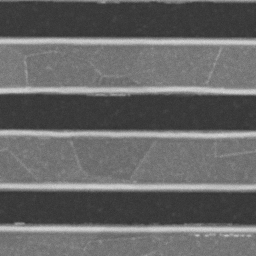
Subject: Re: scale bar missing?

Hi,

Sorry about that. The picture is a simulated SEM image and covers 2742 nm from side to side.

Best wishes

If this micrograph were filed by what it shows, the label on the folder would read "one or a few lines or trenches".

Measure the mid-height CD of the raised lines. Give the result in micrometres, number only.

0.543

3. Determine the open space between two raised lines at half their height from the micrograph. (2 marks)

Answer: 459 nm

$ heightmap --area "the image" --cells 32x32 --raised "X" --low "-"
--------------------------------
--------------------------------
--------------------------------
--------------------------------
--------------------------------
XXXXXXXXXXXXXXXXXXXXXXXXXXXXXXXX
XXXXXXXXXXXXXXXXXXXXXXXXXXXXXXXX
XXXXXXXXXXXXXXXXXXXXXXXXXXXXXXXX
XXXXXXXXXXXXXXXXXXXXXXXXXXXXXXXX
XXXXXXXXXXXXXXXXXXXXXXXXXXXXXXXX
XXXXXXXXXXXXXXXXXXXXXXXXXXXXXXXX
--------------------------------
--------------------------------
--------------------------------
--------------------------------
--------------------------------
--------------------------------
XXXXXXXXXXXXXXXXXXXXXXXXXXXXXXXX
XXXXXXXXXXXXXXXXXXXXXXXXXXXXXXXX
XXXXXXXXXXXXXXXXXXXXXXXXXXXXXXXX
XXXXXXXXXXXXXXXXXXXXXXXXXXXXXXXX
XXXXXXXXXXXXXXXXXXXXXXXXXXXXXXXX
XXXXXXXXXXXXXXXXXXXXXXXXXXXXXXXX
--------------------------------
--------------------------------
--------------------------------
--------------------------------
--------------------------------
--------------------------------
XXXXXXXXXXXXXXXXXXXXXXXXXXXXXXXX
XXXXXXXXXXXXXXXXXXXXXXXXXXXXXXXX
XXXXXXXXXXXXXXXXXXXXXXXXXXXXXXXX